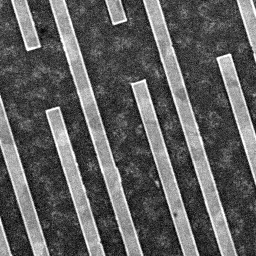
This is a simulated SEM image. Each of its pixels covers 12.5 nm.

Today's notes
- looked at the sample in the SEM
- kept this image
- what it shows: parallel lines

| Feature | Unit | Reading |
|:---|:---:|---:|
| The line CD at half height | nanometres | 173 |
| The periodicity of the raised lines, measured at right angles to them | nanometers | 559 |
